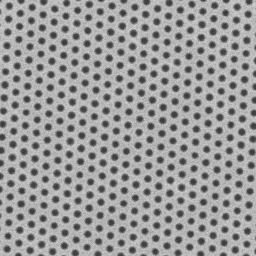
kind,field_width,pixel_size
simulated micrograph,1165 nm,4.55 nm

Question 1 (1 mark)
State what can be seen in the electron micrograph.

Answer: a regular array of holes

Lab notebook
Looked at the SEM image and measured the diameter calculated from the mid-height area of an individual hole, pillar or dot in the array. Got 32.5 nm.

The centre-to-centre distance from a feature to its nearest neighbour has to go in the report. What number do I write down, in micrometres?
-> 0.0587